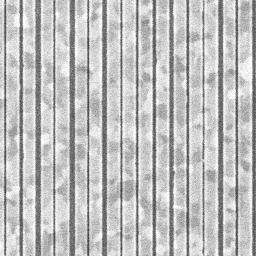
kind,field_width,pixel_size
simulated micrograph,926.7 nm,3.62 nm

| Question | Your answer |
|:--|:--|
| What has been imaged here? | parallel lines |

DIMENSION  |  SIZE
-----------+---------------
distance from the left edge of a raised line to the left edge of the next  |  0.0602 um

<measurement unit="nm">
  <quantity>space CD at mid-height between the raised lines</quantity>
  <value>14.5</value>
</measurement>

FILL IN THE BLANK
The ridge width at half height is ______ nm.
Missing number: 43.5